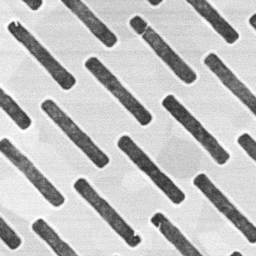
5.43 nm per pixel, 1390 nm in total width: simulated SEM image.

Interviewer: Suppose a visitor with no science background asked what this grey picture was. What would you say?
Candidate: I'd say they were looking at holes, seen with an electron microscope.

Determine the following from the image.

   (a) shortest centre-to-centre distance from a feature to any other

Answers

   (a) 328 nm